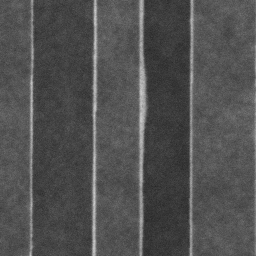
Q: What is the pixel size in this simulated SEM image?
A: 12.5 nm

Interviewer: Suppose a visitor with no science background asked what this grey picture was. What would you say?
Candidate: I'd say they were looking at lines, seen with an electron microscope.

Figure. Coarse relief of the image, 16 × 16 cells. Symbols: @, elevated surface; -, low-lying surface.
@@----@@@---@@@@
@@----@@@---@@@@
@@----@@@---@@@@
@@----@@@---@@@@
@@----@@@---@@@@
@@----@@@---@@@@
@@----@@@---@@@@
@@----@@@---@@@@
@@----@@@---@@@@
@@----@@@---@@@@
@@----@@@---@@@@
@@----@@@---@@@@
@@----@@@---@@@@
@@----@@@---@@@@
@@----@@@---@@@@
@@----@@@---@@@@